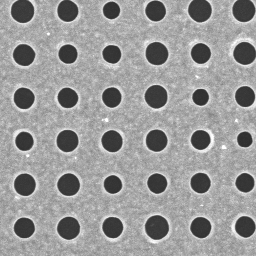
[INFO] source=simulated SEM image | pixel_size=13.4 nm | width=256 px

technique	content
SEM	a regular array of holes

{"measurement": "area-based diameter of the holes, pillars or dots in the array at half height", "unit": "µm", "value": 0.279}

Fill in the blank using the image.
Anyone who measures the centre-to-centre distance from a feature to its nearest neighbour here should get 579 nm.